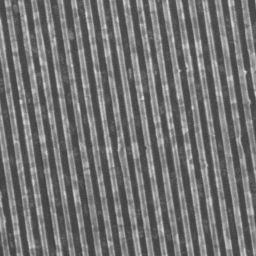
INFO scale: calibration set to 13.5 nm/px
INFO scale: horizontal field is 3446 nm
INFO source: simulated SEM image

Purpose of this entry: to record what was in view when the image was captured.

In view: parallel lines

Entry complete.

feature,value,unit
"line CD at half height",0.0649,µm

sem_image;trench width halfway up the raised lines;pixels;7.66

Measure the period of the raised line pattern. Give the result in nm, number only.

175